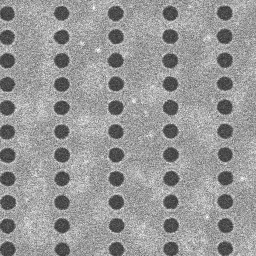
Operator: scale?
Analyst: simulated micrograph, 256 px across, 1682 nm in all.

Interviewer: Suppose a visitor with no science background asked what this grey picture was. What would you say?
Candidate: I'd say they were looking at a regular array of holes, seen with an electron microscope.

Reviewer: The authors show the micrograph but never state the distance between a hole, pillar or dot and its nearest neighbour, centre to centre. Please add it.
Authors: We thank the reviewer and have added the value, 0.153 um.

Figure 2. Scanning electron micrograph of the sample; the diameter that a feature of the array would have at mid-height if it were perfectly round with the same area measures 0.105 µm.